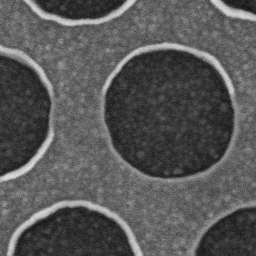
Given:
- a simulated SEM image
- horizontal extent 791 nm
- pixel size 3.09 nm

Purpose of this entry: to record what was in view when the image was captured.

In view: holes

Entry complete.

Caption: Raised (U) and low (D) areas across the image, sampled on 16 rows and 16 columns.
UUUDDDDUUUUUUUUD
UUUUUUUUUUUUUUUU
UUUUUUUUUUUUUUUU
DUUUUUUUDDDDUUUU
DDUUUUUDDDDDDDUU
DDDUUUUDDDDDDDUU
DDDUUUUDDDDDDDUU
DDDUUUUDDDDDDDDU
DDDUUUUDDDDDDDDU
DDUUUUUDDDDDDDUU
DUUUUUUUDDDDDUUU
UUUUUUUUUUUUUUUU
UUUUUUUUUUUUUUUU
UUUDDDDUUUUUUUDD
UDDDDDDDUUUUUDDD
UDDDDDDDUUUUDDDD